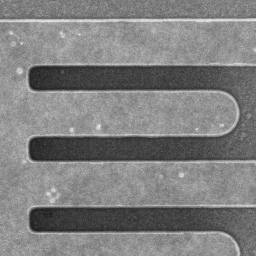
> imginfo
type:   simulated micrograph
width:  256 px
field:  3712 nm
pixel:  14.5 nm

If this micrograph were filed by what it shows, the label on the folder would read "groups of lines, slits or small figures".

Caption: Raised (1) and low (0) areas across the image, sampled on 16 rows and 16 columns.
0000000000000000
1111111111111111
1111111111111111
1111111111111111
1100000000000000
1100000000000000
1111111111111110
1111111111111110
1110000000000000
1100000000000000
1111111111111111
1111111111111111
1111111111111111
1100000000000000
1100000000000000
1111111111111110